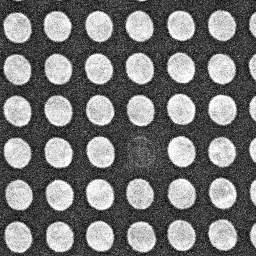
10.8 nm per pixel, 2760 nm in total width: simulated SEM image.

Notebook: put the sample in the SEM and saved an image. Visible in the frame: a regular array of raised bodies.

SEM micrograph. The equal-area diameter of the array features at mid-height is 300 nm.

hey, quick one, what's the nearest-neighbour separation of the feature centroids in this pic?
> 0.439 µm